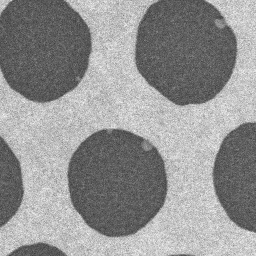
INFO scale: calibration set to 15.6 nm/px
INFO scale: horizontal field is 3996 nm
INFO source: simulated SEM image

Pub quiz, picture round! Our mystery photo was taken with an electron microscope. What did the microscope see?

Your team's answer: holes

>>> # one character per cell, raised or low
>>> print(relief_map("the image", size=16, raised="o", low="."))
.....oooo....ooo
.....oooo.....oo
......ooo......o
......oo.......o
.....oooo......o
o....ooooo....oo
ooooooooooo.oooo
oooooooooooooooo
oooooo...ooooo..
.oooo.....oooo..
.ooo......ooo...
.ooo......ooo...
.ooo......oooo..
.oooo.....oooo..
oooooo...ooooooo
o...oooooooooooo